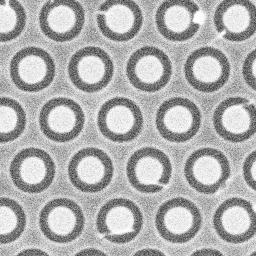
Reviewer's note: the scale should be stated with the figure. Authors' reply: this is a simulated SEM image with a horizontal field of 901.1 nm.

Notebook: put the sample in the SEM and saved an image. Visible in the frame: an array of small figures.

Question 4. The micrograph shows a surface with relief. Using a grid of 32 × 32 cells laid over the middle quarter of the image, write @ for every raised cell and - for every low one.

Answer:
@---@@@@@@---@@---@@@@@@---@@@--
@---@@@@@@---@@---@@@@@@---@@@--
@---@@@@@@--@@@---@@@@@@---@@@--
@---@@@@@---@@@@---@@@@@---@@@--
@@----@@----@@@@-----@----@@@@@-
@@---------@@@@@@--------@@@@@@@
@@@@-----@@@@@@@@@------@@@@@@@@
@@@@@@@@@@@@@@@@@@@@@@@@@@@@@@@@
-@@@@@@@@@@@----@@@@@@@@@@@---@@
---@@@@@@@--------@@@@@@@-------
----@@@@@----------@@@@@--------
@@---@@@@---@@@@---@@@@---@@@@@-
@@---@@@---@@@@@@---@@@---@@@@@@
@@@--@@@---@@@@@@---@@@--@@@@@@@
@@@--@@@---@@@@@@---@@@--@@@@@@@
@@---@@@---@@@@@@---@@@---@@@@@-
@@---@@@@---@@@@----@@@----@@@@-
----@@@@@----------@@@@@--------
---@@@@@@@--------@@@@@@@-------
-@@@@@@@@@@@-----@@@@@@@@@-----@
@@@@@@@@@@@@@@@@@@@@@@@@@@@@@@@@
@@@@------@@@@@@@@------@@@@@@@@
@@---------@@@@@@---------@@@@@@
@@----@-----@@@@----------@@@@@-
@---@@@@@---@@@@---@@@@@---@@@--
@---@@@@@@--@@@---@@@@@@---@@@--
@---@@@@@@---@@---@@@@@@---@@@--
@---@@@@@@---@@---@@@@@@---@@@--
@---@@@@@---@@@@---@@@@@---@@@--
@@---@@@----@@@@---@@@@---@@@@@-
@@---------@@@@@@--------@@@@@@@
@@@-------@@@@@@@@-------@@@@@@@